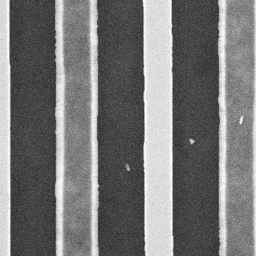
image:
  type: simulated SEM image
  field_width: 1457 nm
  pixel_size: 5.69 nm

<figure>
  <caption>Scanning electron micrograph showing lines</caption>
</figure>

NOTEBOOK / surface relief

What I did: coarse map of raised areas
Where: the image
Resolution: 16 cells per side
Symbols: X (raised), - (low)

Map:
X---XX---XX---XX
X---XX---XX---XX
X---XX---XX---XX
X---XX---XX---XX
X---XX---XX---XX
X---XX---XX---XX
X---XX---XX---XX
X---XX---XX---XX
X---XX---XX---XX
X---XX---XX---XX
X---XX---XX---XX
X---XX---XX---XX
X---XX---XX---XX
X---XX---XX---XX
X---XX---XX---XX
X---XX---XX---XX